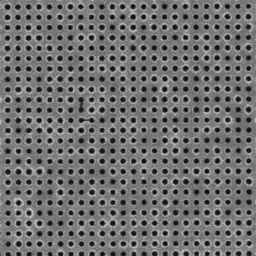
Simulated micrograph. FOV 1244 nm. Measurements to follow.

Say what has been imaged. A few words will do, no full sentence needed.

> a regular array of holes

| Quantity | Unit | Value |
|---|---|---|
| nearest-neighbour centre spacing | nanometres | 49.4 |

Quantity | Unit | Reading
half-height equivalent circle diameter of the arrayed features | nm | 24.5